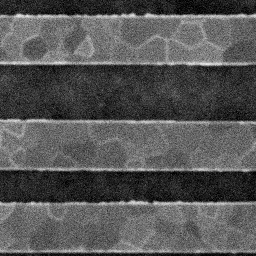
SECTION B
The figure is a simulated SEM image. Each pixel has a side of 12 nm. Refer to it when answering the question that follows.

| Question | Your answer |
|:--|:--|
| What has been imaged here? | lines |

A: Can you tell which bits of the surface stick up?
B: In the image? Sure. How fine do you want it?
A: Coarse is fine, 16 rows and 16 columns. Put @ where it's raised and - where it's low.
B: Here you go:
----------------
@@@@@@@@@@@@@@@@
@@@@@@@@@@@@@@@@
@@@@@@@@@@@@@@@@
----------------
----------------
----------------
----------------
@@@@@@@@@@@@@@@@
@@@@@@@@@@@@@@@@
@@@@@@@@@@@@@@@@
----------------
----------------
@@@@@@@@@@@@@@@@
@@@@@@@@@@@@@@@@
@@@@@@@@@@@@@@@@